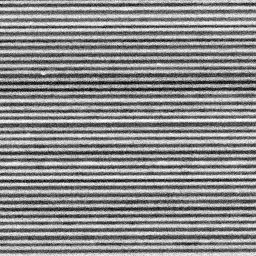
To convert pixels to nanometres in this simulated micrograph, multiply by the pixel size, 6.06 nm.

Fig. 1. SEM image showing parallel lines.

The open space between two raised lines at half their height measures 29.6 nm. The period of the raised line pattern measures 42.6 nanometres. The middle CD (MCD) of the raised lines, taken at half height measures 0.0174 microns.